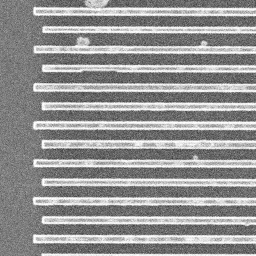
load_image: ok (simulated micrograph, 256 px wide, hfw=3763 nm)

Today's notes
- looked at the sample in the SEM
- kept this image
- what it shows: parallel lines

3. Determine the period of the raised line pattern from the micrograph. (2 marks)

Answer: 0.278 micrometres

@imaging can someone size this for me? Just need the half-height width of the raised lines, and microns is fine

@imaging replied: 0.0918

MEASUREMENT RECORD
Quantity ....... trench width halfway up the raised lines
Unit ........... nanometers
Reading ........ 186